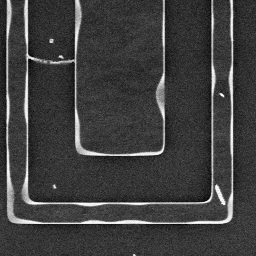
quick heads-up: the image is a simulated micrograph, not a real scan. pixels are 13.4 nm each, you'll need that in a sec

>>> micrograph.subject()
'groups of lines, slits or small figures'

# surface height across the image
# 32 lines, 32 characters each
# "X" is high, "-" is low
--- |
-XX-------XXXXXXXXXX------XXX---
-XX-------XXXXXXXXXX------XXX---
-XX-------XXXXXXXXXX-------XX---
-XX-------XXXXXXXXXX-------XX---
-XX-------XXXXXXXXXX------XXX---
-XX-------XXXXXXXXXX------XXX---
-XX-------XXXXXXXXXXX-----XXX---
-XXX-----XXXXXXXXXXXX-----XXX---
-XX------XXXXXXXXXXXX-----XXX---
-XX------XXXXXXXXXXX-------XX---
-XX------XXXXXXXXXXX-------XX---
-XX-------XXXXXXXXXX------XXX---
-XX-------XXXXXXXXXX------XXX---
-XX-------XXXXXXXXXX------XXX---
-XX-------XXXXXXXXXX------XXX---
-XX-------XXXXXXXXXXX-----XXX---
-XX-------XXXXXXXXXXX-----XXX---
-XX-------XXXXXXXXXXX-----XXX---
-XX-------XXXXXXXXXX-------XX---
-XX------------------------XX---
-XX------------------------XX---
-XX------------------------XX---
-XX------------------------XX---
-XX-----------------------XXX---
-XX-----------------------XXX---
-XXXXXXXXX--XXXXXXXXXXXXXXXXX---
-XXXXXXXXXXXXXXXXXXXXXXXXXXXX---
--XXXXXXXXXXXXXXXXXXXXXXXXXX----
--------------------------------
--------------------------------
--------------------------------
--------------------------------